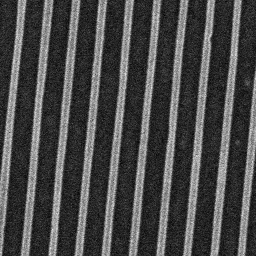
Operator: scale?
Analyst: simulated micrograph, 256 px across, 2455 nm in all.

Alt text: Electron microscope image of parallel lines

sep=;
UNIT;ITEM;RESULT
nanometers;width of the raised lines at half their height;58.4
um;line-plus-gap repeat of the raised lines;0.258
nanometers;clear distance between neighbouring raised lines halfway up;199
